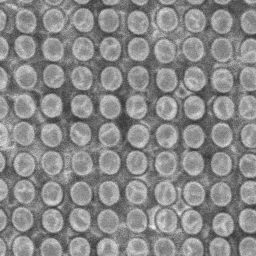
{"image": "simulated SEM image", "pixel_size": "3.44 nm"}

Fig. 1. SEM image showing a regular array of raised bodies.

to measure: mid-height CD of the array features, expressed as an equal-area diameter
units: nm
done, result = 73.6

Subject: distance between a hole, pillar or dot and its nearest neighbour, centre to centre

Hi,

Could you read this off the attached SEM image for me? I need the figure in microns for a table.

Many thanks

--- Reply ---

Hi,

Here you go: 0.0933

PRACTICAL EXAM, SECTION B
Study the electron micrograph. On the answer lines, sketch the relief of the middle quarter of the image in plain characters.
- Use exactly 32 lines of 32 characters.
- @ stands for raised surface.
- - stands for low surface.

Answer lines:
--------------------------------
---@@@----@@@@---@@@----@@@----@
--@@@@@--@@@@@--@@@@@--@@@@@--@@
--@@@@@--@@@@@--@@@@@--@@@@@--@@
--@@@@@---@@@@--@@@@@--@@@@@--@@
---@@@----@@@@---@@@@---@@@@-@-@
-------------------------@@--@--
--------------------------------
---@@@----@@@---@@@@-----@-----@
--@@@@@--@@@@@--@@@@----@@@@--@@
--@@@@@--@@@@@--@@@@@--@@@@@--@@
--@@@@@--@@@@@--@-@@@--@@@@@--@@
---@@@----@@@@--@@@@----@@@@---@
-------------------------@@-----
--------------------------------
--@@@@----@@@----@@@----@@-----@
--@@@@---@@@@----@@@@--@@@@@--@@
--@@@@---@@@@@--@@@@@--@@@@@--@@
--@@@@---@@@@@--@@@@@--@@@@@--@@
---@@@---@@@@----@@@@---@@@@--@@
------------------@@----@@@----@
--------------------------------
---@@@----@@@---@@@@----@@@----@
--@@@@@--@@@@@--@@@@---@@@@@--@@
--@@@@@--@@@@@--@@@@@--@@@@@--@@
--@@@@@--@@@@@--@@@@@--@@@@@--@@
---@@@@---@@@---@@@@---@@@@@--@@
----@--------------------@@-----
-------------------@------------
-----------------@@-------------
--@@@@---@@@@---@@@@---@@@@----@
--@@@@@--@@@@@--@@@@@--@@@@@--@@